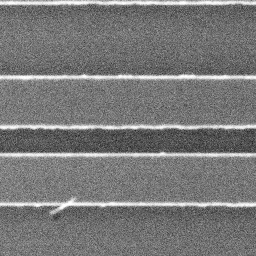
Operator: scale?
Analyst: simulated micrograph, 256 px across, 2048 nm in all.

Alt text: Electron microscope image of lines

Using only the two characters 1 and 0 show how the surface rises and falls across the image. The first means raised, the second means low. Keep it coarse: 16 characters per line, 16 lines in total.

0000000000000000
0000000000000000
0000000000000000
0000000000000000
0000000000000000
1111111111111111
1111111111111111
1111111111111111
0000000000000000
0000000000000000
1111111111111111
1111111111111111
1111111111111111
0000000000000000
0000000000000000
0000000000000000